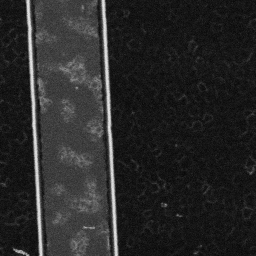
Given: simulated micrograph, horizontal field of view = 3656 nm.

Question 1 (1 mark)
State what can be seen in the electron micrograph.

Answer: one or a few lines or trenches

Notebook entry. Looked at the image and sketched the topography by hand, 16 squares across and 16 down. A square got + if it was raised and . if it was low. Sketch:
++....++++++++++
++.....+++++++++
++.....+++++++++
++.....+++++++++
++.....+++++++++
++.....+++++++++
++.....+++++++++
++.....+++++++++
++.....+++++++++
++.....+++++++++
++.....+++++++++
++.....+++++++++
++.....+++++++++
++.....+++++++++
++.....+++++++++
+++....+++++++++